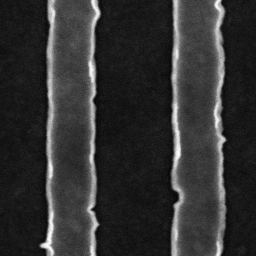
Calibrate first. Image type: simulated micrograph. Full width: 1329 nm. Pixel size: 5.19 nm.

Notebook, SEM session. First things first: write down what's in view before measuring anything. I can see one or a few lines or trenches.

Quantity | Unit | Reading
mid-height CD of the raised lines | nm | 237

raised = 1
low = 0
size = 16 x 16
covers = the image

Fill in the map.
0001110000011100
0001110000011100
0001110000011100
0001110000011100
0001110000011100
0001110000011100
0001110000011100
0001110000011100
0001110000011100
0001110000011100
0001110000011100
0001110000011100
0001110000011100
0001110000011100
0001110000011100
0001110000011100